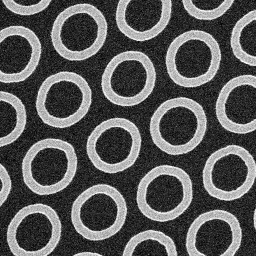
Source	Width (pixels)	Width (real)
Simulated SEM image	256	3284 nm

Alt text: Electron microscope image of ring-shaped raised bodies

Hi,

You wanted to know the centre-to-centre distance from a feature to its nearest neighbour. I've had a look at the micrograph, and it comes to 874 nm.